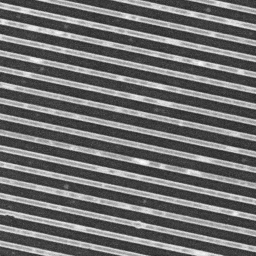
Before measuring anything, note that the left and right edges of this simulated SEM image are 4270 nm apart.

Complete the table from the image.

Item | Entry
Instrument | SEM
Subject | parallel lines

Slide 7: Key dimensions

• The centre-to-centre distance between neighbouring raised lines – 259 nm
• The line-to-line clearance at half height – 176 nanometres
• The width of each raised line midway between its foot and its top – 77.5 nanometres